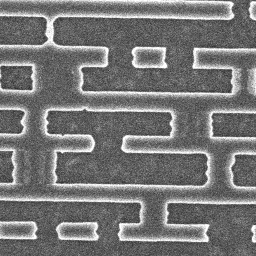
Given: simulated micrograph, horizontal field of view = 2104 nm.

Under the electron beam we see parallel lines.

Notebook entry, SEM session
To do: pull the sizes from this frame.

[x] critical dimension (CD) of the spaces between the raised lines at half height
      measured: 206 nm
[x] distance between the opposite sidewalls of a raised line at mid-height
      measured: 146 nm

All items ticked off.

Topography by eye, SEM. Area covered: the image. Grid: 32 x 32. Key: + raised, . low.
+++++++++++++++++++++++++++++..+
+++++++++++++++++++++++++++++..+
......+.........................
......+.........................
......+.........................
......+.........................
+++++++++++++....++++...++++++++
+++++++++++++....++++...++++++++
....++++++..............++++++++
....++++++...................+++
....++++++...................+++
+++++++++++..++++............+++
++++++++++++++++++++++++++++++++
++++++++++++++++++++++++++++++++
...+++...............+++++......
...+++...............+++++......
...+++...............++++++.....
++++++++++++...+++++++++++++++++
++++++++++++...+++++++++++++++++
..+++++...................++++..
..+++++...................+++...
..+++++...................+++...
..+++++...................+++...
++++++++++++++++++++++++++++++++
++++++++++++++++++++++++++++++++
.................++++...........
..................+++...........
.................++++...........
+++++..+++++...+++++++++++......
++++...+++++...+++++++++++......
................................
................................